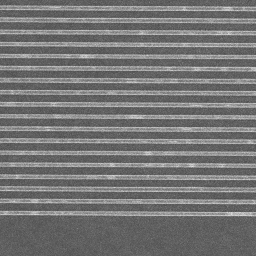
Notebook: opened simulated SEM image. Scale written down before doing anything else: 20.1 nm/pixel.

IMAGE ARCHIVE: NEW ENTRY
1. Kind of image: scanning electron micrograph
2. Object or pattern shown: parallel lines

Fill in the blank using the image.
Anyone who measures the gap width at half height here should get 163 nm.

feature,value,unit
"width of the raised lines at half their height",75.3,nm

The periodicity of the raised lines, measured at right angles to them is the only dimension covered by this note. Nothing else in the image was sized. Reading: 0.242 micrometres